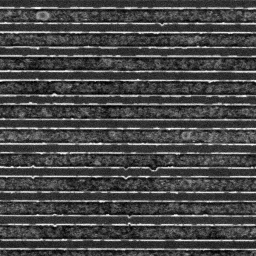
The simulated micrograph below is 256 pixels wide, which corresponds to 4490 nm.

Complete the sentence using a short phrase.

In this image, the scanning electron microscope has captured parallel lines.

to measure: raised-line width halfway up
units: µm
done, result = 0.171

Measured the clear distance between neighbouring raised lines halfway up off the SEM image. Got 256 nanometers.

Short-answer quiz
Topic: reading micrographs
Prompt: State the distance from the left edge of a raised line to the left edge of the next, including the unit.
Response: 24.1 px